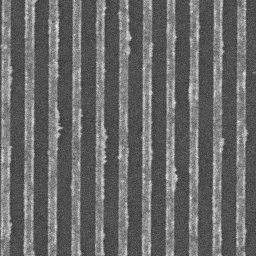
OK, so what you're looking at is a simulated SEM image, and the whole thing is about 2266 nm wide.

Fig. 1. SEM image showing parallel lines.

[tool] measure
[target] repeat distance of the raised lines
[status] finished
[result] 23.5 pixels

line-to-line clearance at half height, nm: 137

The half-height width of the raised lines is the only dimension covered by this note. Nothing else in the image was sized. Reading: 73 nm